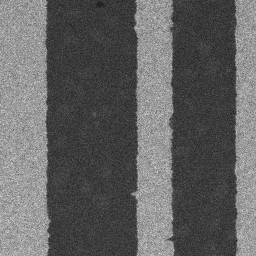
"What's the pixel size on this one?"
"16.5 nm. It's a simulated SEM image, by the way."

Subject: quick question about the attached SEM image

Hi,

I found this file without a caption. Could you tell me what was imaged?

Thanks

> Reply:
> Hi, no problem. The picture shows one or a few lines or trenches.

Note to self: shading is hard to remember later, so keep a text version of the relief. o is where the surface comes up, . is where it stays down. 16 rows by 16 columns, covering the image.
ooo......oo....o
ooo.....ooo....o
ooo......oo....o
ooo......oo....o
ooo......oo....o
ooo......oo....o
ooo......oo....o
ooo......oo....o
ooo......oo....o
ooo......oo....o
ooo......oo....o
ooo......oo....o
ooo......oo....o
ooo......oo....o
ooo......oo....o
ooo......oo....o